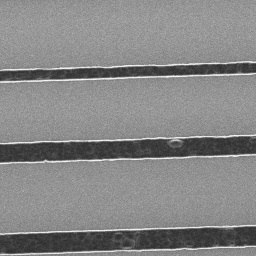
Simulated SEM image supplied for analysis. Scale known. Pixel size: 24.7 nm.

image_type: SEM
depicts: one or a few lines or trenches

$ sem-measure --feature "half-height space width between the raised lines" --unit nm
1620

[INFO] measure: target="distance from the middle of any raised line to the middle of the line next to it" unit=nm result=2080